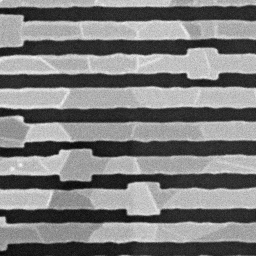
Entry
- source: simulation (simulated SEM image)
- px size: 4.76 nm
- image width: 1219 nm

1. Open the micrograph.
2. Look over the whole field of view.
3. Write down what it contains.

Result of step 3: wiring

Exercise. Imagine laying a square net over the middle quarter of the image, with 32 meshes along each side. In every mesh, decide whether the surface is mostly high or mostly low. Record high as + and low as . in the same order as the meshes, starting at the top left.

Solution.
++++++++++++++++++++++++++++++++
++++++++++++++++++++++++++++++++
...............................+
...............................+
................................
................................
++++++++++++++++++++++++++++++++
++++++++++++++++++++++++++++++++
++++++++++++++++++++++++++++++++
++++++++++++++++++++++++++++++++
++++++++++++++++++++++++++++++..
................................
................................
................................
................................
++++++++++++++++++++++++++++++++
++++++++++++++++++++++++++++++++
++++++++++++++++++++++++++++++++
++++++++++++++++++++++++++++++++
................................
................................
.++++++.........................
+++++++.........................
+++++++++....+++++++++++++++++++
++++++++++++++++++++++++++++++++
++++++++++++++++++++++++++++++++
++++++++++++++++++++++++++++++++
+++++++...................++....
+++++++.........................
................................
................++++++++........
.....+++++.....+++++++++++++++++